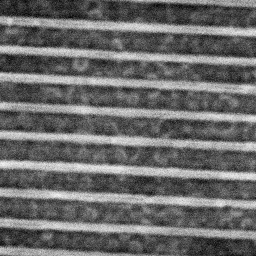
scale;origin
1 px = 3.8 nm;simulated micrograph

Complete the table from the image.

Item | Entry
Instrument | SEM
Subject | parallel lines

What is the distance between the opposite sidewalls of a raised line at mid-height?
5.37 px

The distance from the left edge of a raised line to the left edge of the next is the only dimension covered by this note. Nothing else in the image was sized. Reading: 110 nm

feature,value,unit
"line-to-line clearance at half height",88.4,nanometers